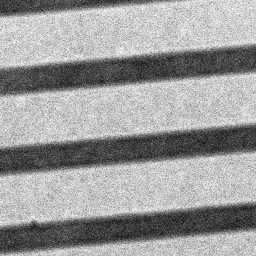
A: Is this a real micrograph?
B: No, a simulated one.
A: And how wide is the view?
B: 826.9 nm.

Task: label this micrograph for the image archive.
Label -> one or a few lines or trenches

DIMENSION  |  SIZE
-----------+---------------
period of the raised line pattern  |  0.254 microns